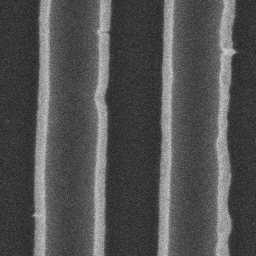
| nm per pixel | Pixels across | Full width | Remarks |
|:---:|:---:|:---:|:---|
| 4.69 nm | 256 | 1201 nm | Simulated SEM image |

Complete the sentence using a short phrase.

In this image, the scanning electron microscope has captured one or a few lines or trenches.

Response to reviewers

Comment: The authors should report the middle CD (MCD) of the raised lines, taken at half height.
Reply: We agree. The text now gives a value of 0.288 micrometres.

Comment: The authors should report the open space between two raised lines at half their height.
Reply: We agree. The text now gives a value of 62.2 pixels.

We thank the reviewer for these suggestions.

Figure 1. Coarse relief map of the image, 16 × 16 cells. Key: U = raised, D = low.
DDDUUUUDDDUUUUDD
DDDUUUUDDDUUUUDD
DDDUUUUDDDUUUUDD
DDDUUUUDDDUUUUDD
DDDUUUDDDDUUUUDD
DDDUUUDDDDUUUUDD
DDDUUUDDDDUUUUDD
DDDUUUDDDDUUUUDD
DDDUUUDDDDUUUUDD
DDUUUUDDDDUUUUDD
DDUUUUDDDDUUUUDD
DDUUUUDDDDUUUUDD
DDUUUUDDDDUUUUDD
DDUUUUDDDDUUUUDD
DDUUUUDDDDUUUUDD
DDUUUUDDDDUUUUDD